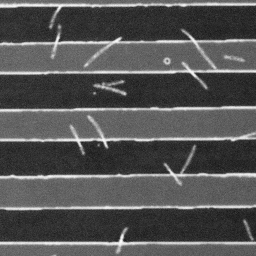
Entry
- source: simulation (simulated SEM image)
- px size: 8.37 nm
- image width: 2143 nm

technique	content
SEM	lines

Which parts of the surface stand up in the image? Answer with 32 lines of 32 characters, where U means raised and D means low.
UUUUUUUUUUUUUUUUUUUUUUUUUUUUUUUU
DDDDDDDDDDDDDDDDDDDDDDDDDDDDDDDD
DDDDDDDDDDDDDDDDDDDDDDDDDDDDDDDD
DDDDDDDDDDDDDDDDDDDDDDDDDDDDDDDD
DDDDDDDDDDDDDDDDDDDDDDDDDDDDDDDD
UDDUUUUUUUUUUUUUUUUUUUUUUUUUUUUU
UUUUUUUUUUUUUUUUUUUUUUUUUUUUUUUU
UUUUUUUUUUUUUUUUUUUUUUUUUUUUUUUU
UUUUUUUUUUUUUUUUUUUUUUUUUUUUUUUU
DDDDDDDDDDDDDDDDDDDDDDDDDDDDDDDD
DDDDDDDDDDDDDDDDDDDDDDDDDDDDDDDD
DDDDDDDDDDDDDDDDDDDDDDDDDDDDDDDD
DDDDDDDDDDDDDDDDDDDDDDDDDDDDDDDD
DDDDDDDDDDDDDDDDDDDDDDDDDDDUUUUU
UUUUUUUUUUUUUUUUUUUUUUUUUUUUUUUU
UUUUUUUUUUUUUUUUUUUUUUUUUUUUUUUU
UUUUUUUUUUUUUUUUUUUUUUUUUUUUUUUU
UUUUUUUUUUUUUUDDDUUDDDDDDDDDDDDD
DDDDDDDDDDDDDDDDDDDDDDDDDDDDDDDD
DDDDDDDDDDDDDDDDDDDDDDDDDDDDDDDD
DDDDDDDDDDDDDDDDDDDDDDDDDDDDDDDD
DDDDDDDDDDDDDDDDDDDDDDDDDDDDDDDD
UUUUUUUUUUUUUUUUUUUUUUUUUUUUUUUU
UUUUUUUUUUUUUUUUUUUUUUUUUUUUUUUU
UUUUUUUUUUUUUUUUUUUUUUUUUUUUUUUU
UUUUUUUUUUUUUUUUUUUUUUUUUUUUUUUU
DDDDDDDDDDDDDDDDDDDDDDDDDDDDDDDD
DDDDDDDDDDDDDDDDDDDDDDDDDDDDDDDD
DDDDDDDDDDDDDDDDDDDDDDDDDDDDDDDD
DDDDDDDDDDDDDDDDDDDDDDDDDDDDDDDD
UUUUUUUUUUUUUUUUUUUUUUUUUUUUUUUU
UUUUUUUUUUUUUUUUUUUUUUUUUUUUUUUU